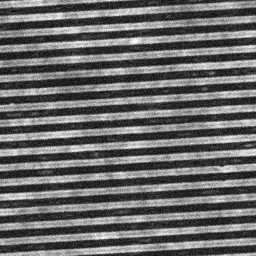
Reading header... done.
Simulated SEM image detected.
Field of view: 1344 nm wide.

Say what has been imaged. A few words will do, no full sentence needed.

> parallel lines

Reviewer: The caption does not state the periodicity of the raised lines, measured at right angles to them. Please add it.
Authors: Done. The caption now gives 0.0776 micrometres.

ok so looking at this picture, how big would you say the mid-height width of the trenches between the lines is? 0.0425 micrometres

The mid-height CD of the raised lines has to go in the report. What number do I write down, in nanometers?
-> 32.7